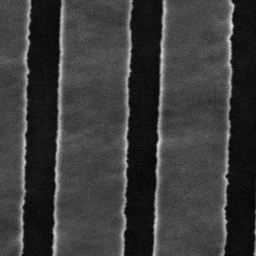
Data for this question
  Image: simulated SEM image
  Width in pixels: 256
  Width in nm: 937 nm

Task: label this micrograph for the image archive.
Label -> lines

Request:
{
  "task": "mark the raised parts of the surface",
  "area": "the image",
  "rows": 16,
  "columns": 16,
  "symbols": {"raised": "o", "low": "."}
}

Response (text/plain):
oo..oooo..ooooo.
oo..oooo..oooo..
oo..oooo..oooo..
oo..oooo..oooo..
oo..oooo..oooo..
oo..oooo..oooo..
oo..oooo..oooo..
oo..oooo..oooo..
oo..oooo..oooo..
oo..oooo..oooo..
oo.ooooo..oooo..
oo.ooooo..oooo..
o..ooooo..oooo..
o..ooooo..oooo..
o..ooooo..oooo..
o..ooooo..oooo..